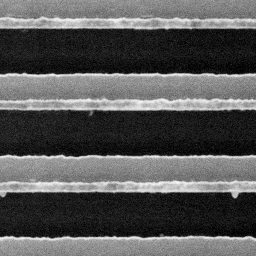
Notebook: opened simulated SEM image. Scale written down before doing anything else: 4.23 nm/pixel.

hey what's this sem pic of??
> lines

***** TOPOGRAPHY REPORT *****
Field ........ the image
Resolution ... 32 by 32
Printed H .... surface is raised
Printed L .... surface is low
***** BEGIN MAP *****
HHHHHHHHHHHHHHHHHHHHHHHHHHHHHHHH
HHHHHHHHHHHHHHHHHHHHHHHHHHHHHHHH
HHHHHHHHHHHHHHHHHHHHHHHHHHHHHHHH
LLLLLLLLLLLLLLLLLLLLLLLLLLLLLLLL
LLLLLLLLLLLLLLLLLLLLLLLLLLLLLLLL
LLLLLLLLLLLLLLLLLLLLLLLLLLLLLLLL
LLLLLLLLLLLLLLLLLLLLLLLLLLLLLLLL
LLLLLLLLLLLLLLLLLLLLLLLLLLLLLLLL
LLLLLLLLLLLLLLLLLLLLLLLLLLLLLLLL
HHHHHHHHHHHHHHHHHHHHHHHHHHHHHHHH
HHHHHHHHHHHHHHHHHHHHHHHHHHHHHHHH
HHHHHHHHHHHHHHHHHHHHHHHHHHHHHHHH
HHHHHHHHHHHHHHHHHHHHHHHHHHHHHHHH
HHHHHHHHHHHHHHHHHHHHHHHHHHHHHHHH
LLLLLLLLLLLLLLLLLLLLLLLLLLLLLLLL
LLLLLLLLLLLLLLLLLLLLLLLLLLLLLLLL
LLLLLLLLLLLLLLLLLLLLLLLLLLLLLLLL
LLLLLLLLLLLLLLLLLLLLLLLLLLLLLLLL
LLLLLLLLLLLLLLLLLLLLLLLLLLLLLLLL
LLLLLLLLLLLLLLLLLLLLLLLLLLLLLLLL
HHHHHHHHHHHHHHHHHHHHHHHHHHHHHHHH
HHHHHHHHHHHHHHHHHHHHHHHHHHHHHHHH
HHHHHHHHHHHHHHHHHHHHHHHHHHHHHHHH
HHHHHHHHHHHHHHHHHHHHHHHHHHHHHHHH
LLLLLLLLLLLLLLLLLLLLLLLLLLLLLLLL
LLLLLLLLLLLLLLLLLLLLLLLLLLLLLLLL
LLLLLLLLLLLLLLLLLLLLLLLLLLLLLLLL
LLLLLLLLLLLLLLLLLLLLLLLLLLLLLLLL
LLLLLLLLLLLLLLLLLLLLLLLLLLLLLLLL
LLLLLLLLLLLLLLLLLLLLLLLLLLLLLLLL
HHHHHHHHHHHHHHHHHHHHHHHHHHHHHHHH
HHHHHHHHHHHHHHHHHHHHHHHHHHHHHHHH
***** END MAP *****